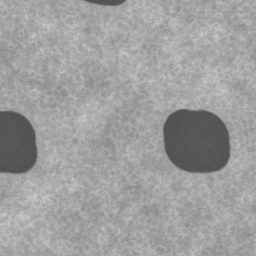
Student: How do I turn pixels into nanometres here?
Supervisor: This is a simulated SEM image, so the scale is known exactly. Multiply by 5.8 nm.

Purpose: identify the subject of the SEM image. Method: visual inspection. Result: holes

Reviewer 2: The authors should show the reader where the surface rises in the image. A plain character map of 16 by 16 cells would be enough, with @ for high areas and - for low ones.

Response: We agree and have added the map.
@@@@@@@@@@@@@@@@
@@@@@@@@@@@@@@@@
@@@@@@@@@@@@@@@@
@@@@@@@@@@@@@@@@
@@@@@@@@@@@@@@@@
@@@@@@@@@@@@@@@@
@@@@@@@@@@@@@@@@
--@@@@@@@@----@@
--@@@@@@@@----@@
--@@@@@@@@----@@
--@@@@@@@@@---@@
@@@@@@@@@@@@@@@@
@@@@@@@@@@@@@@@@
@@@@@@@@@@@@@@@@
@@@@@@@@@@@@@@@@
@@@@@@@@@@@@@@@@